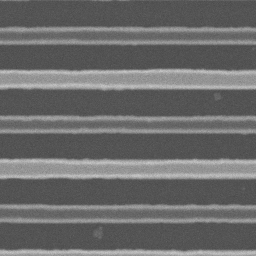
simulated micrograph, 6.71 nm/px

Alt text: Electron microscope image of lines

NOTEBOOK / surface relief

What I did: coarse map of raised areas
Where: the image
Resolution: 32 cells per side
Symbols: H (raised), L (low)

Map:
LLLLLLLLLLLLLLLLLLLLLLLLLLLLLLLL
LLLLLLLLLLLLLLLLLLLLLLLLLLLLLLLL
LLLLLLLLLLLLLLLLLLLLLLLLLLLLLLLL
LLLLLLLLLLHLLLLLLLLLLLLLLLLLLLLL
HHHHHHHHHHHHHHHHHHHHHHHHHHHHHHHH
HHHHHHLLLHHHHHHHHHHHHLHHHHHHHHHH
LLLLLLLLLLLLLLLLLLLLLLLLLLLLLLLL
LLLLLLLLLLLLLLLLLLLLLLLLLLLLLLLL
LLLLLLLLLLLLLLLLLLLLLLLLLLLLLLLL
HHHHHHHHHHHHHHHHHHHHHHHHHHHHHHHH
HHHHHHHHHHHHHHHHHHHHHHHHHHHHHHHH
LLLLLLLLLLLLLLLLLLLLLLLLLLLLLLLL
LLLLLLLLLLLLLLLLLLLLLLLLLLLLLLLL
LLLLLLLLLLLLLLLLLLLLLLLLLLLLLLLL
LLLLLLLLLLLLLLLLLLLLLLLLLLLLLLLL
HHHHHHHHHHHHHHHHHHHHHHHHHHHHHHHH
HHHHHHLLHHHHLLLLHHHHHHHHHHHHHHHH
LLLLLLLLLLLLLLLLLLLLLLLLLLLLLLLL
LLLLLLLLLLLLLLLLLLLLLLLLLLLLLLLL
LLLLLLLLLLLLLLLLLLLLLLLLLLLLLLLL
HHHHHHHHHHHHHHHHHHHHHHHHHHHHHHHH
HHHHHHHHHHHHHHHHHHHHHHHHHHHHHHHH
LLLLLLLLLLLLLLLLLLLLLLLLLLLLLLLL
LLLLLLLLLLLLLLLLLLLLLLLLLLLLLLLL
LLLLLLLLLLLLLLLLLLLLLLLLLLLLLLLL
LLLLLLLLLLLLLLLLLLLLLLLLLLLLLLLL
HHHHHHHHHHHHHHHHHHHHHHHHHHHHHHHH
HHHHHHHHHHHHHHHHHHHHHHHHHHHHHHHH
LLLLLLLLLLLLLLLLLLLLLLLLLLLLLLLL
LLLLLLLLLLLLLLLLLLLLLLLLLLLLLLLL
LLLLLLLLLLLLLLLLLLLLLLLLLLLLLLLL
HHHHHHHHHHHHHHHHHHHHHHHHHHHHHHHH